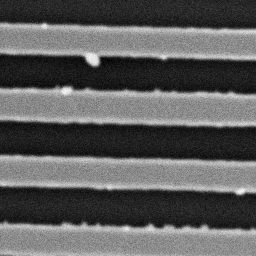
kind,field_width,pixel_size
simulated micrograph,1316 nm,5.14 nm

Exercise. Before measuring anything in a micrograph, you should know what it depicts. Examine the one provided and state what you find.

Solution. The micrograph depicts lines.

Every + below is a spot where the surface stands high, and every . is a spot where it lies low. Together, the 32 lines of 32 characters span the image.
................................
................................
................................
+++++++++++++++++++.............
++++++++++++++++++++++++++++++++
++++++++++++++++++++++++++++++++
++++++++++++++++++++++++++++++++
...........+....................
................................
................................
................................
+++++++++++++++++...............
++++++++++++++++++++++++++++++++
++++++++++++++++++++++++++++++++
++++++++++++++++++++++++++++++++
..................++++++++++++++
................................
................................
................................
................................
++++++++++++++++++++++++++++++++
++++++++++++++++++++++++++++++++
++++++++++++++++++++++++++++++++
............++++++++++++++++++++
................................
................................
................................
................................
+++++++++++++++++...............
++++++++++++++++++++++++++++++++
++++++++++++++++++++++++++++++++
++++++++++++++++++++++++++++++++